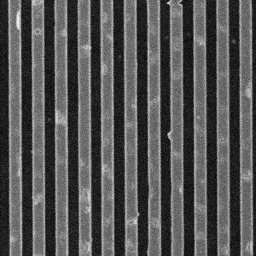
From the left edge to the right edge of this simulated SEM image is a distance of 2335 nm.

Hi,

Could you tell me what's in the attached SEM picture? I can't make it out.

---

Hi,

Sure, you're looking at parallel lines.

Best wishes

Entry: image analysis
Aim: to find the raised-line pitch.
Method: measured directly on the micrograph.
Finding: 0.211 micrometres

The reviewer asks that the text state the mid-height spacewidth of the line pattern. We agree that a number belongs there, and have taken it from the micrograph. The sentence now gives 0.103 micrometres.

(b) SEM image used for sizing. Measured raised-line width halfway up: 111 nanometres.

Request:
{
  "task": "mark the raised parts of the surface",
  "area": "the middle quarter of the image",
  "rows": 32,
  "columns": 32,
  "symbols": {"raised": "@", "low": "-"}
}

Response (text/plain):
@---@@@--@@@---@@@---@@@---@@@--
@---@@@--@@@---@@@---@@@---@@@--
@---@@@--@@@---@@@---@@@---@@@--
@---@@@--@@@---@@@---@@@---@@@--
@---@@@--@@@---@@@---@@@---@@@--
@---@@@--@@@---@@@---@@@---@@@--
@---@@@--@@@---@@@---@@@---@@@--
@---@@@--@@@---@@@---@@@---@@@--
@---@@@--@@@---@@@---@@@---@@@--
@---@@@--@@@---@@@---@@@---@@@--
@---@@@--@@@---@@@---@@@---@@@--
@---@@@--@@@---@@@---@@@---@@@--
@---@@@--@@@---@@@---@@@---@@@--
@---@@@--@@@---@@@---@@@---@@@--
@---@@@--@@@---@@@---@@@---@@@--
@---@@@--@@@---@@@---@@@---@@@--
@---@@@--@@@---@@@---@@@---@@@--
@---@@@--@@@---@@@---@@@--@@@@--
@---@@@--@@@---@@@---@@@--@@@@--
@---@@@--@@@---@@@---@@@---@@@--
@---@@@--@@@---@@@---@@@---@@@--
@---@@@--@@@---@@@---@@@---@@@--
@---@@---@@@---@@@---@@@---@@@--
@---@@---@@@---@@@---@@@---@@@--
@---@@@--@@@---@@@---@@@---@@@--
@---@@@--@@@---@@@---@@@---@@@--
@---@@@--@@@---@@@---@@@---@@@--
@---@@@--@@@---@@@---@@@---@@@--
@---@@@--@@@---@@@---@@@---@@@--
@---@@@--@@@---@@@---@@@---@@@--
@---@@@---@@---@@@---@@@---@@@--
@---@@@---@@---@@@---@@@---@@@--